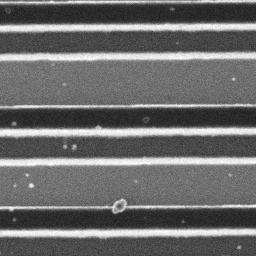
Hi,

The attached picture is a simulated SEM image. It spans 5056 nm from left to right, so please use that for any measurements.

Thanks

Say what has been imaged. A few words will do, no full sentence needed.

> lines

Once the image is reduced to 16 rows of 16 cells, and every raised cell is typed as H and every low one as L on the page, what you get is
HHHHHHHHHHHHHHHH
HHHHHHHHHHHHHHHH
LLLLLLLLLLLLLLLL
LLLLLLLLLLLLLLLL
HHHHHHHHHHHHHHHH
HHHHHHHHHHHHHHHH
HHHHHHHHHHHHHHHH
HHHHHHHHHHHHHHHH
LLLLLLLLLLLLLLLL
LLLLLLLLLLLLLLLL
HHHHHHHHHHHHHHHH
HHHHHHHHHHHHHHHH
HHHHHHHHHHHHHHHH
HHHHHHHHHHHHHHHH
LLLLLLLLLLLLLLLL
LLLLLLLLLLLLLLLL